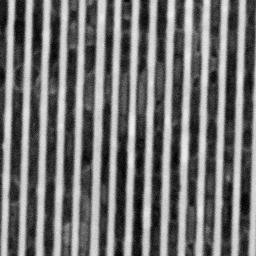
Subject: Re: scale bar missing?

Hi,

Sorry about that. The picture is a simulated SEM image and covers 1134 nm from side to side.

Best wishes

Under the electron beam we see parallel lines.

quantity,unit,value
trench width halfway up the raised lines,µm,0.0498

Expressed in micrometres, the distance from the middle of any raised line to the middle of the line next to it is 0.0786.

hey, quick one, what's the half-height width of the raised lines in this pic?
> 28.8 nanometers